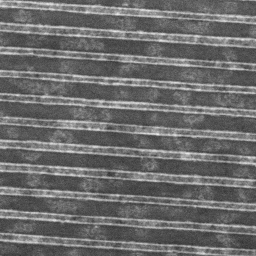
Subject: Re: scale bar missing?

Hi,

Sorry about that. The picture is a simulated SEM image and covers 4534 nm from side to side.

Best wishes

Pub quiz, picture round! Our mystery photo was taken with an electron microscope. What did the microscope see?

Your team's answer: parallel lines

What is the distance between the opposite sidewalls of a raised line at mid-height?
115 nm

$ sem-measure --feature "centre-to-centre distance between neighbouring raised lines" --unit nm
413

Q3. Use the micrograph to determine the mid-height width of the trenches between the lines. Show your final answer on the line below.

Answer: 292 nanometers